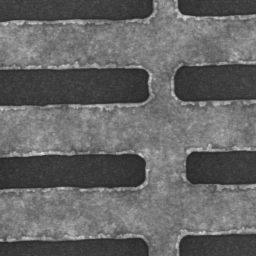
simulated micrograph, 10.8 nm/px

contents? holes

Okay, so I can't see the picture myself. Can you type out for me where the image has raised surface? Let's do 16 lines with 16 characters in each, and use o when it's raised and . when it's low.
..........o.....
oooooooooooooooo
oooooooooooooooo
oooooooooooooooo
.........oo.....
.........oo.....
......oooooooooo
oooooooooooooooo
oooooooooooooooo
oooooooooooo....
.........ooo....
.........ooo....
oooooooooooooooo
oooooooooooooooo
oooooooooooooooo
.........oo.....